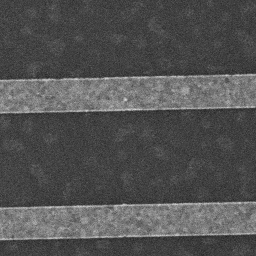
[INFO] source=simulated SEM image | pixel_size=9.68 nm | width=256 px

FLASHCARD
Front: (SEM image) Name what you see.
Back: one or a few lines or trenches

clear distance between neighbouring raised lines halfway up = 95.2 pixels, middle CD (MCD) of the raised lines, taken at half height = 305 nm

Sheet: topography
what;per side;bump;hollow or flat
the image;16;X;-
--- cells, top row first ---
----------------
----------------
----------------
----------------
----------------
XXXXXXXXXXXXXXXX
XXXXXXXXXXXXXXXX
----------------
----------------
----------------
----------------
----------------
----------------
XXXXXXXXXXXXXXXX
XXXXXXXXXXXXXXXX
----------------